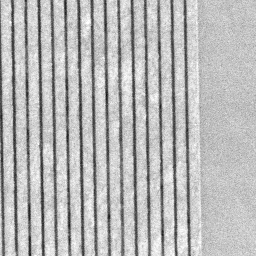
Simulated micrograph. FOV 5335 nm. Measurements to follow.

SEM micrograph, parallel lines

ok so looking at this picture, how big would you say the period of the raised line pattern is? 13.3 px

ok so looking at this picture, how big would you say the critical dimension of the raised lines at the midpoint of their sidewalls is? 208 nanometres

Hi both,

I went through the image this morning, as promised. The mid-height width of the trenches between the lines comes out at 65.1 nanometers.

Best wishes